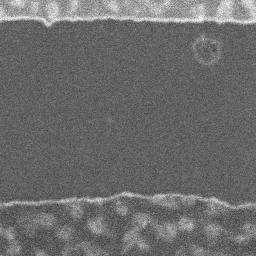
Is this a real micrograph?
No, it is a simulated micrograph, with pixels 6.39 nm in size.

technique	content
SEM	one or a few lines or trenches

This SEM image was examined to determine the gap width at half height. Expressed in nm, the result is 1150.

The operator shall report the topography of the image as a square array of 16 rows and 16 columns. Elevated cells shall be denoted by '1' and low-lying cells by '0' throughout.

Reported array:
1111111111111111
0000000000000000
0000000000000000
0000000000000000
0000000000000000
0000000000000000
0000000000000000
0000000000000000
0000000000000000
0000000000000000
0000000000000000
0000000000000000
0000111111111000
1111111111111111
1111111111111111
1111111111111111